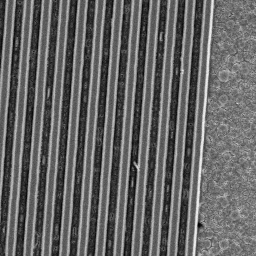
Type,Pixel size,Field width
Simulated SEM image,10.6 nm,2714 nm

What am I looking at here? parallel lines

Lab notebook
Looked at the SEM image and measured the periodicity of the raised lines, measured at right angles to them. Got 17.9 pixels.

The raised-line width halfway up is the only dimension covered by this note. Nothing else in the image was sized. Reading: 92.5 nanometres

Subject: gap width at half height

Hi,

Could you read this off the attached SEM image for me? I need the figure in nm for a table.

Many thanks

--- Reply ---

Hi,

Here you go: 92.5